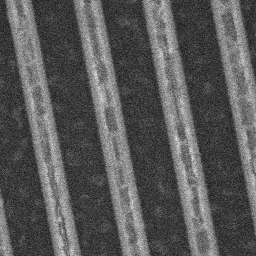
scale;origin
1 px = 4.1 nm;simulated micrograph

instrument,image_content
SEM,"one or a few lines or trenches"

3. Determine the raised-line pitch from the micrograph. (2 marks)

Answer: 277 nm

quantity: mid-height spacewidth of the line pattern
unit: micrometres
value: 0.195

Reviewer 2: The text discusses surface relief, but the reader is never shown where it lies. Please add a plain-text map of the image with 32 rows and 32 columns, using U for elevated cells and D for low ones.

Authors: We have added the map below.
DUUUDDDDDDUUDDDDDDUUUDDDDDDUUUDD
DUUUDDDDDDUUDDDDDDDUUDDDDDDUUUDD
DDUUDDDDDDUUUDDDDDDUUDDDDDDUUUDD
DDUUDDDDDDUUUDDDDDDUUDDDDDDUUUDD
DDUUDDDDDDUUUDDDDDDUUUDDDDDDUUDD
DDUUDDDDDDDUUDDDDDDUUUDDDDDDUUUD
DDUUUDDDDDDUUDDDDDDDUUDDDDDDUUUD
DDDUUDDDDDDUUUDDDDDDUUDDDDDDUUUD
DDDUUDDDDDDUUUDDDDDDUUDDDDDDUUUD
DDDUUDDDDDDDUUDDDDDDUUUDDDDDDUUD
DDDUUDDDDDDDUUDDDDDDUUUDDDDDDUUU
DDDUUUDDDDDDUUDDDDDDDUUDDDDDDUUU
DDDDUUDDDDDDUUUDDDDDDUUDDDDDDUUU
DDDDUUDDDDDDUUUDDDDDDUUDDDDDDUUU
DDDDUUDDDDDDDUUDDDDDDUUUDDDDDDUU
DDDDUUDDDDDDDUUDDDDDDUUUDDDDDDUU
DDDDUUUDDDDDDUUDDDDDDUUUDDDDDDUU
DDDDDUUDDDDDDUUDDDDDDDUUDDDDDDUU
DDDDDUUDDDDDDUUUDDDDDDUUDDDDDDUU
DDDDDUUDDDDDDUUUDDDDDDUUUDDDDDUU
DDDDDUUDDDDDDDUUDDDDDDUUUDDDDDDU
DDDDDUUUDDDDDDUUDDDDDDUUUDDDDDDU
DDDDDDUUDDDDDDUUDDDDDDDUUDDDDDDU
DDDDDDUUDDDDDDUUUDDDDDDUUDDDDDDU
DDDDDDUUDDDDDDUUUDDDDDDUUUDDDDDU
DDDDDDUUDDDDDDDUUDDDDDDUUUDDDDDD
DDDDDDUUUDDDDDDUUDDDDDDUUUDDDDDD
DDDDDDUUUDDDDDDUUDDDDDDDUUDDDDDD
UDDDDDDUUDDDDDDUUUDDDDDDUUDDDDDD
UDDDDDDUUDDDDDDUUUDDDDDDUUUDDDDD
UDDDDDDUUDDDDDDDUUDDDDDDUUUDDDDD
UDDDDDDUUUDDDDDDUUDDDDDDUUUDDDDD